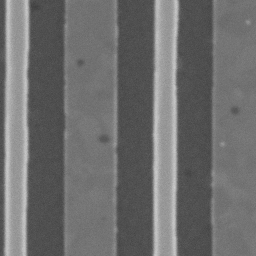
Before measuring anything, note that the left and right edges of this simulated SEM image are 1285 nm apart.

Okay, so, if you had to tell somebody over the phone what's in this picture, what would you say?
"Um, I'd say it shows lines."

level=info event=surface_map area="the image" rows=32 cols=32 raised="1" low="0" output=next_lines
01110000111111100000110000011111
01110000111111100000110000011111
01110000111111100000110000011111
01110000111111100000110000011111
01110000111111100000110000011111
01110000111111100000110000011111
01110000111111100000110000011111
01100000111111100000110000011111
01100000111111100000110000011111
01100000111111100000110000011111
01100000111111100000110000011111
01100000111111100000110000011111
01100000111111100001110000011111
01100000111111100001110000011111
01100000111111100001110000011111
01100000111111100001110000011111
01100000111111100001110000011111
01100000111111100001110000011111
01100000111111000001110000011111
01100000111111000001110000011111
01100000111111100001110000011111
01100000111111000001110000011111
01100000111111100001110000011111
01100000111111000001110000011111
01100000111111000001110000011111
01100000111111000001110000011111
01100000111111000001110000011111
01100000111111000001110000011111
01100000111111100001110000011111
01100000111111000001110000011111
01100000111111000001110000011111
01100000111111000001110000011111